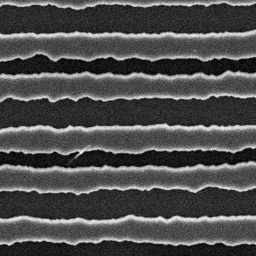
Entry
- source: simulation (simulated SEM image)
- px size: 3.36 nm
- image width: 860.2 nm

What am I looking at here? lines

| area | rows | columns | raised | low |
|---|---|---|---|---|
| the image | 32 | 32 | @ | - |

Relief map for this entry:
@@@@@@@@@@@@@@@@@@@@@@@@@@@-@@@@
--------------------------------
--------------------------------
--------------------------------
@@@@@@@@@@@@@@@@@@@@@@@@@@@@@@@@
@@@@@@@@@@@@@@@@@@@@@@@@@@@@@@@@
@@@@@@@@@@@@@@@@@@@@@@@@@@@@@@@@
@------------------------@------
--------------------------------
@@@@@@@@@@@@@@@@@@@@@@@@@@@@@@@@
@@@@@@@@@@@@@@@@@@@@@@@@@@@@@@@@
@@@@@@@@@@@@@@@@@@@@@@@@@@@@@@@@
---@--@------@------------------
--------------------------------
--------------------------------
--------------------------------
@@@@@@@@@@@@@@@@@@@@@@@@@@@@@@@@
@@@@@@@@@@@@@@@@@@@@@@@@@@@@@@@@
@@@@@@@@@@@@@@@@@@@@@@@@@@@@@@@@
--------------------------------
------------------------------@@
@@@@@@@@@@@@@@@@@@@@@@@@@@@@@@@@
@@@@@@@@@@@@@@@@@@@@@@@@@@@@@@@@
@@@@@@@@@@@@@@@@@@@-@@@@@@--@@@@
--------------------------------
--------------------------------
--------------------------------
@@@@@@---@@---@@@@@@@@@@@@@@@@@@
@@@@@@@@@@@@@@@@@@@@@@@@@@@@@@@@
@@@@@@@@@@@@@@@@@@@@@@@@@@@@@@@@
@@-------@----------@@@@@-@-@@-@
--------------------------------